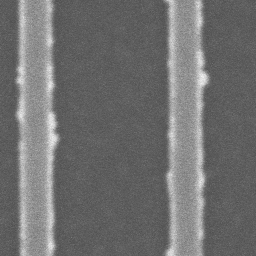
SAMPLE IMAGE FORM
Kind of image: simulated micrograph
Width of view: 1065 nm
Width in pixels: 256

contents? one or a few lines or trenches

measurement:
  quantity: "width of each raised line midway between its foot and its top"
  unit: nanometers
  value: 133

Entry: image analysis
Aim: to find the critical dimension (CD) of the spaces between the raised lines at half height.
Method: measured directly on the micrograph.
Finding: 487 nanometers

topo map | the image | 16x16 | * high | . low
.**........**...
.**........**...
.**........**...
.**........**...
.**........**...
.**........**...
.**........**...
.**........**...
.***.......**...
.**........**...
.**........**...
.**........**...
.**........**...
.**........**...
.**........**...
.**........**...